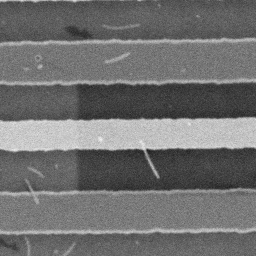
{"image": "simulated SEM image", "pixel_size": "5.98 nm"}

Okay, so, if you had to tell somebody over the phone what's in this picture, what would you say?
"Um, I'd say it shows lines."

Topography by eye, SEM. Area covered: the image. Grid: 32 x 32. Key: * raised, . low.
................................
................................
................................
................................
................................
********************************
********************************
********************************
********************************
********************************
.******.*.......*...............
................................
................................
................................
................................
********************************
********************************
********************************
*********************..*........
................................
................................
................................
................................
................................
********************************
********************************
********************************
********************************
********************************
................................
................................
................................